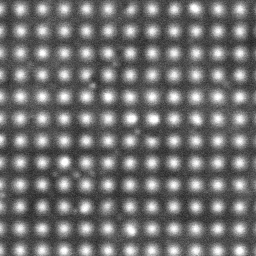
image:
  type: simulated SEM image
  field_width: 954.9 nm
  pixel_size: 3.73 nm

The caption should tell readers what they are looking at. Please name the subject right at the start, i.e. an array of small figures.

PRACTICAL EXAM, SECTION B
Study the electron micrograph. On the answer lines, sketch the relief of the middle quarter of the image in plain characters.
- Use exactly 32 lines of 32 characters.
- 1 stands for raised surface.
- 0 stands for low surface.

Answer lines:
00000000000000000000000000000000
11001110001110011100011100111001
11001110011110011100111100111101
11001110011110011100111100111001
00000110001100011100011000111000
00000001000000000000000000000000
10001110001100011000011000010000
11001110011110011100111100111001
11001110011110011100111100111001
10001110001110011100011100111001
00000000000000000000000000000000
00000000000000000000000000000000
10001110011110011100011000111001
11001111011110011100111100111001
11001111011110011100111100111001
00000000001100001000011000010000
00000000000000000000000000000000
10000100001100000000000000000000
11001110011110011100111100111001
11001110011110011100111100111001
11001110011110011100111100111001
00000000000000000000000000000000
00000000000000000000000000000000
10001110011110011100111000111001
11001110011110011100111100111001
11001110011110011100111100111001
10000110000000011000011000010000
00000000000000000000000000000000
10001100001100001000011000000000
11001110011110011100111100111001
11001110011110011100111100111001
10001110001100011100111100111001